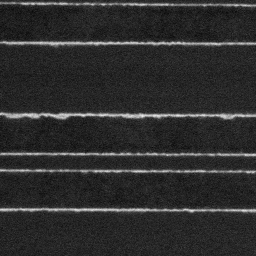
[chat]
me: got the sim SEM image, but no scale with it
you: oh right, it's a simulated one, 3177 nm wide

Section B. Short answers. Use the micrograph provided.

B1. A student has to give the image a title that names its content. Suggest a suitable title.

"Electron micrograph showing lines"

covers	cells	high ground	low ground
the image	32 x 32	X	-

---------------XXXXXXXXXXXXXXXXX
--------------------------------
--------------------------------
--------------------------------
--------------------------------
XXXXXXXXXXXXXXXXXXXXXXXXXXXXXXXX
XXXXXXXXXXXXXXXXXXXXXXXXXXXXXXXX
XXXXXXXXXXXXXXXXXXXXXXXXXXXXXXXX
XXXXXXXXXXXXXXXXXXXXXXXXXXXXXXXX
XXXXXXXXXXXXXXXXXXXXXXXXXXXXXXXX
XXXXXXXXXXXXXXXXXXXXXXXXXXXXXXXX
XXXXXXXXXXXXXXXXXXXXXXXXXXXXXXXX
XXXXXXXXXXXXXXXXXXXXXXXXXXXXXXXX
XXXXXXXXXXXXXXXXXXXXXXXXXXXXXXXX
-------XX-----------------------
--------------------------------
--------------------------------
--------------------------------
--------------------------------
XXXXXXXXXXXXXXXXXXXXXXXXXXXXXXXX
XXXXXXXXXXXXXXXXXXXXXXXXXXXXXXXX
------------------------------XX
--------------------------------
--------------------------------
--------------------------------
--------------------------------
XXXXXXXXXXXXXXXXXXXXXXXXXXXXXXXX
XXXXXXXXXXXXXXXXXXXXXXXXXXXXXXXX
XXXXXXXXXXXXXXXXXXXXXXXXXXXXXXXX
XXXXXXXXXXXXXXXXXXXXXXXXXXXXXXXX
XXXXXXXXXXXXXXXXXXXXXXXXXXXXXXXX
XXXXXXXXXXXXXXXXXXXXXXXXXXXXXXXX